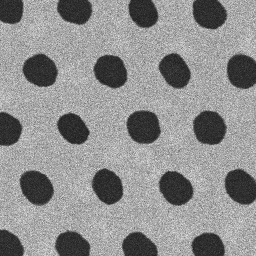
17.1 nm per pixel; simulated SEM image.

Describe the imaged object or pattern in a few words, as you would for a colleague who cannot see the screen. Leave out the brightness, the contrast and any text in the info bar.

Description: a regular array of holes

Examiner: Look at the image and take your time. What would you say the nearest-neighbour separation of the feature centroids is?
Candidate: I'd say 1130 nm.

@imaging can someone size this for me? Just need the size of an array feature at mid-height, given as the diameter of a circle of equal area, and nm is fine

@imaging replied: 565